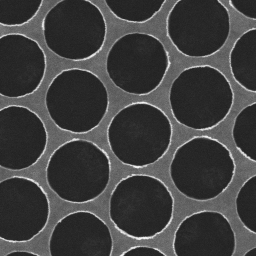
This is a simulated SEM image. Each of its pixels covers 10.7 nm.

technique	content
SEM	holes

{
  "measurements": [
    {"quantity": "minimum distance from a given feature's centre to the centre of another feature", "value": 762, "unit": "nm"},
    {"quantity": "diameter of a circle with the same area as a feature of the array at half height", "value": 664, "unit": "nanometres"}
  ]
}